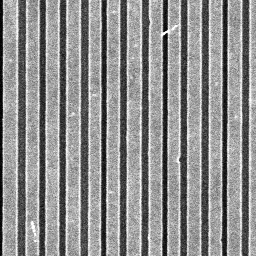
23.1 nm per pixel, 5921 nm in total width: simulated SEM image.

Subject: parallel lines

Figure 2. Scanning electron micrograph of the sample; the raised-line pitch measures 472 nm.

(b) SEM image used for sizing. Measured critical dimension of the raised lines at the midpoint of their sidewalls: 0.312 microns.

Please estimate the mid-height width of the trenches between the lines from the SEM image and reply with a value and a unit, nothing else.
7.5 px